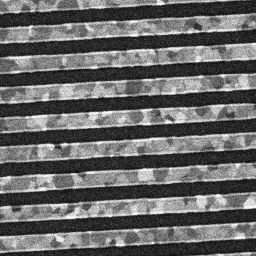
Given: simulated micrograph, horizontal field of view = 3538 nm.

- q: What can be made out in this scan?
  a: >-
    parallel lines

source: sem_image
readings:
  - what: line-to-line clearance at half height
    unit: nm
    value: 212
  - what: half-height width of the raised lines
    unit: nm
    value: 202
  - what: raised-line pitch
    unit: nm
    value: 412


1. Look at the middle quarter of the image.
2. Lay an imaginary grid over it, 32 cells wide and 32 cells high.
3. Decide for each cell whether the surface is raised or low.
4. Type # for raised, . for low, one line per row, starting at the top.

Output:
############..#.................
................................
................................
..............................##
.............###################
################################
################################
####################.###........
###.............................
................................
................................
......................##########
....############################
################################
##########################.##...
############....................
................................
................................
...........................#..##
.............###################
################################
################################
####################............
###.............................
................................
................................
....................#.##########
....############################
################################
###########################.....
########........................
................................